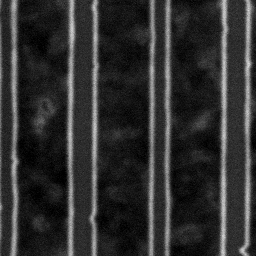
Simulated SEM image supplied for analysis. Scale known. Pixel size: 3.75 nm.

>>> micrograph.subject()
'one or a few lines or trenches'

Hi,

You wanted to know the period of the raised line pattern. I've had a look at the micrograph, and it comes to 0.287 µm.